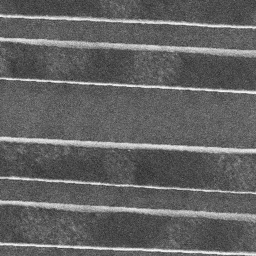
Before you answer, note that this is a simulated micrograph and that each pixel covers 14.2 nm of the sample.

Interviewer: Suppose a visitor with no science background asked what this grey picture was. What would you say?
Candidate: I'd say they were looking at lines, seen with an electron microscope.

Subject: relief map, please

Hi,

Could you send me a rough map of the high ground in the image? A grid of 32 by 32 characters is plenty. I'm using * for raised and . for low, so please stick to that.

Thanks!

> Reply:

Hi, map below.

********************************
********************************
............********************
................................
................................
**********......................
****************************....
********************************
********************************
********************************
............********************
..............................**
................................
................................
................................
................................
................................
****............................
************************........
********************************
********************************
********************************
.....***************************
....................************
................................
*****...........................
********************............
********************************
********************************
********************************
********************************
........................********